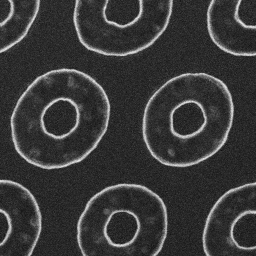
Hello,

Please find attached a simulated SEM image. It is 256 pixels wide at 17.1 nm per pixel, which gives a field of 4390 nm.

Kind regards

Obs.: ring-shaped raised bodies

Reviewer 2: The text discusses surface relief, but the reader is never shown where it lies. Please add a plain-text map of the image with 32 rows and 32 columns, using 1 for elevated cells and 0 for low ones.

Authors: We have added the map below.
01111000001110000011100000111100
01111000011110000011100000111100
01110000011110000111100000111100
11110000001111111111100000111111
11100000001111111111000000111111
11000000001111111110000000011111
00000000000001111000000000000111
00000000000000000000000000000000
00000000000000000000000000000000
00000111111000000000001111000000
00001111111100000000011111110000
00011111111110000000111111111000
00111110111110000001111111111000
00111100011111000011110001111000
00111000001111000011110000111000
00111000001110000011110001111000
00111100011110000011110001110000
00111111111100000011111111110000
00111111111100000001111111100000
00011111111000000001111111000000
00001111100000000000011100000000
00000000000000000000000000000000
00000000000000000000000000000000
11100000000000111100000000000011
11110000000011111111000000001111
11110000000111111111000000011111
11111000000111101111100000111111
01111000001111000111100000111100
01111000001110000111100000111000
01111000001110000111100001111000
11110000001111001111000001111100
11110000001111111111000000111111